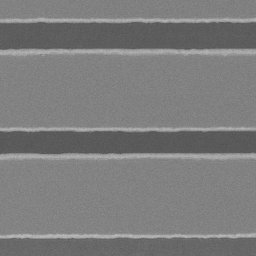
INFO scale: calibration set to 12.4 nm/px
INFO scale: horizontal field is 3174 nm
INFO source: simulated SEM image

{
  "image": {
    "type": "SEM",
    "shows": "lines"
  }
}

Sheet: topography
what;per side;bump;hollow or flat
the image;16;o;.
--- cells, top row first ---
oooooooooooooooo
................
................
oooooooooooooooo
oooooooooooooooo
oooooooooooooooo
oooooooooooooooo
oooooooooooooooo
................
................
oooooooooooooooo
oooooooooooooooo
oooooooooooooooo
oooooooooooooooo
oooooooooooooooo
................